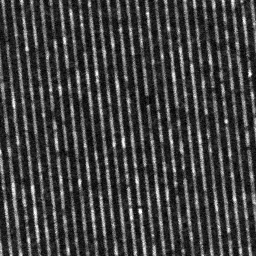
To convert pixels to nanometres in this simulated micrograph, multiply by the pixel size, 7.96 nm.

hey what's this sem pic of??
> parallel lines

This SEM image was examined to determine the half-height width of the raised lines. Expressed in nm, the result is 19.8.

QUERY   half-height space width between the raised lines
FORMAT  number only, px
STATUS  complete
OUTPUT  6.85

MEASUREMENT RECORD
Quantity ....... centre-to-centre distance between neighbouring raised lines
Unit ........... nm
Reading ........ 75.8